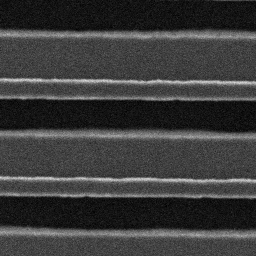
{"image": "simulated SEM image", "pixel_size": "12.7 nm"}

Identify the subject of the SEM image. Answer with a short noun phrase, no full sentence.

lines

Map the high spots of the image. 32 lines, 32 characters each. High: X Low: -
--------------------------------
--------------------------------
--------------------------------
--------------------------------
XXXXXXXXXXXXXXXXXX-XX-XXXX------
XXXXXXXXXXXXXXXXXXXXXXXXXXXXXXXX
XXXXXXXXXXXXXXXXXXXXXXXXXXXXXXXX
XXXXXXXXXXXXXXXXXXXXXXXXXXXXXXXX
XXXXXXXXXXXXXXXXXXXXXXXXXXXXXXXX
XXXXXXXXXXXXXXXXXXXXXXXXXXXXXXXX
XXXXXXXXXXXXXXXXXXXXXXXXXXXXXXXX
XXXXXXXXXXXXXXXXXXXXXXXXXXXXXXXX
--------------------------------
--------------------------------
--------------------------------
--------------------------------
--------------------------------
XXXXXXXXXXXXXXXXXXXXXXXXXXXXXXXX
XXXXXXXXXXXXXXXXXXXXXXXXXXXXXXXX
XXXXXXXXXXXXXXXXXXXXXXXXXXXXXXXX
XXXXXXXXXXXXXXXXXXXXXXXXXXXXXXXX
XXXXXXXXXXXXXXXXXXXXXXXXXXXXXXXX
XXXXXXXXXXXXXXXXXXXXXXXXXXXXXXXX
XXXXXXXXXXXXXXXXXXXXXXXXXXXXXXXX
-------XXXXXXXXXXXXXXXXXXXXXXXXX
--------------------------------
--------------------------------
--------------------------------
--------------------------------
XXXXXXXXXXXXXXXXXXXXXXXXXXXXXXXX
XXXXXXXXXXXXXXXXXXXXXXXXXXXXXXXX
XXXXXXXXXXXXXXXXXXXXXXXXXXXXXXXX